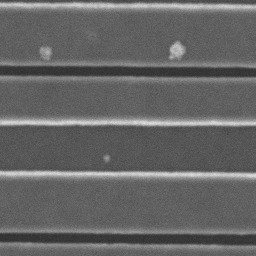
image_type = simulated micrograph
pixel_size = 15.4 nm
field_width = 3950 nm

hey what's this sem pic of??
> lines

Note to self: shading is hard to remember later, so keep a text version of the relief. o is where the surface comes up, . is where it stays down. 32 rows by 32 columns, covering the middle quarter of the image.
.................ooooooooooooooo
................................
................................
oooooooooooooooooo.o............
oooooooooooooooooooooooooooooooo
oooooooooooooooooooooooooooooooo
oooooooooooooooooooooooooooooooo
oooooooooooooooooooooooooooooooo
oooooooooooooooooooooooooooooooo
oooooooooooooooooooooooooooooooo
oooooooooooooooooooooooooooooooo
oooooooooooooooooooooooooooooooo
oooooooooooooooooooooooooooooooo
oooooooooooooooooooooooooooooooo
oooooooooooooooooooooooooooooooo
................................
................................
................................
................................
................................
................................
................................
................................
................................
................................
................................
................................
................................
oooooooooooooooooooooooooooooooo
oooooooooooooooooooooooooooooooo
oooooooooooooooooooooooooooooooo
oooooooooooooooooooooooooooooooo